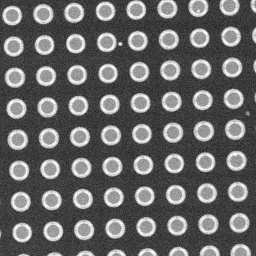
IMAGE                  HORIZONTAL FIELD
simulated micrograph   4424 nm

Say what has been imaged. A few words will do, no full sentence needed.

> an array of small figures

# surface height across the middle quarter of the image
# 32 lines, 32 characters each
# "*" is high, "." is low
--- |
...*......**.....****...*****...
.****....****....****...*****...
.*****...****....****...*****...
.****....****....****....***....
..***.....**....................
................................
................................
...................*......**....
..***.....***....****....****...
..****...*****...****....****...
.*****...*****...****....****...
..****....***.....***.....**....
..***...........................
................................
................................
..................***.....***...
..****....****...*****...*****..
..****...*****...*****...*****..
..****...*****...*****...****...
..****....***.....***...........
...**...........................
................................
................................
...........**.....***.....***...
..****....****....****...*****..
..*****...****....****...*****..
..*****...****....****....***...
...***.....**...................
................................
................................
...........................**...
....*......***....****....****..